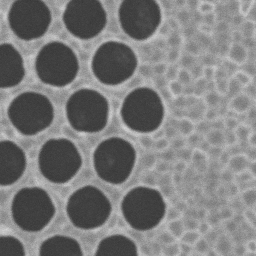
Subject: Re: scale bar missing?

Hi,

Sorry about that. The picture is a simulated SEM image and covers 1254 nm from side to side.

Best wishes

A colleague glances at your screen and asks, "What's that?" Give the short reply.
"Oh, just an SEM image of a regular array of holes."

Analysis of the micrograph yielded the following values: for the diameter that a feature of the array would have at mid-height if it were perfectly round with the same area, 221 nanometers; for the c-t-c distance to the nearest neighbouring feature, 268 nm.